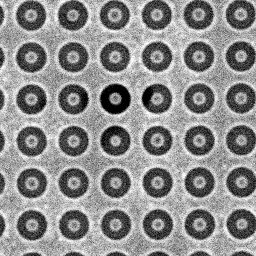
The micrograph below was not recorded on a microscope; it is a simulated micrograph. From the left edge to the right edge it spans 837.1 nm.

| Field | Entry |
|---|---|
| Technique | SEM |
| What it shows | an array of small figures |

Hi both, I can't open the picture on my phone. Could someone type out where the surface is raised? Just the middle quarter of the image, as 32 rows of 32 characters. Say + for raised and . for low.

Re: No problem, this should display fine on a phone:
......++++......++++......+++++.
.....++++++....++++++....+++++++
++++++++++++++++++++++++++++++++
++++++++++++++++++++++++++++++++
++++++++++++++++++++++++++++++++
....+++++++....++++++.....+++++.
.....+++++......++++.......++++.
......+++...++..++++...+...+++..
.+++..+++...++...++...+++..+++..
.+++..+++...++...+++..++...+++..
......+++.......++++.......+++..
.....+++++......+++++.....+++++.
+...++++++++..++++++++..++++++++
++++++++++++++++++++++++++++++++
++++++++++++++++++++++++++++++++
+..+++++++++..++++++++..++++++++
.....+++++......+++++.....+++++.
......+++.......++++.......+++..
.+++..+++...++...+++..+++..+++..
.+++..+++...++...++...+++..+++..
..+...+++........+++...+...+++..
......++++......++++......+++++.
.....++++++....++++++....+++++++
++++++++++++++++++++++++++++++++
++++++++++++++++++++++++++++++++
++++++++++++++++++++++++++++++++
....+++++++....++++++.....++++++
......++++......++++.......++++.
..+...+++........+++...+...+++..
.+++..+++...++...++...+++..+++..
.+++..+++...++...+++..+++..+++..
......+++.......++++.......++++.